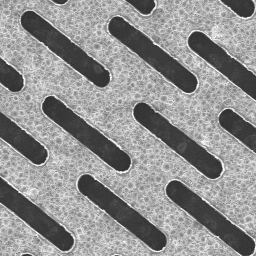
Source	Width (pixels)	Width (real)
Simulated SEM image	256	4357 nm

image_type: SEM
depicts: holes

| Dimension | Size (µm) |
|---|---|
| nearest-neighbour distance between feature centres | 1.49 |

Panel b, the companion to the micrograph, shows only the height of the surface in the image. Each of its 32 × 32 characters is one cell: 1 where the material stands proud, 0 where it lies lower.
11111111111111110001111111110000
11101111111111111101111111111000
11100011111111001111111111111111
11100001111111000111111111111111
11110000111111000011111100111111
11111000011111100001111100011111
11111110000111111000011100001111
11111111000011111100001111000111
00111111100001111110000111100001
00011111111000111111000011110000
00011111111100111111110001111000
11111111111111111111111011111110
11111101111111111111111111111111
11111000011111111001111111111111
01111100001111111000111111100011
00111110000111111100011111110001
00011111000011111110000111111000
00001111110000111111000011111100
11000011111000011111100001111110
11100011111100001111111000011111
11111111111110001111111100001111
11111111111111111111111110001111
01111111110011111111111111111111
00111111110001111111100111111111
00011111111000011111100001111111
00001111111100001111110000111111
11000011111110000111111000011111
11100001111111000011111110000111
11110000111111110000111111000011
11111000011111111000011111100001
11111110011111111100011111110000
11111111111111111111111111111100